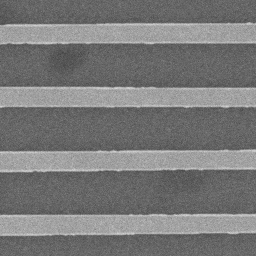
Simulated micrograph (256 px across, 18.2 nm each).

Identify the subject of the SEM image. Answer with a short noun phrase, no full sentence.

lines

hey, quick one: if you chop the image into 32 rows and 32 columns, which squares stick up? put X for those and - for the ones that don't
--------------------------------
--------------------------------
--------------------------------
XXXXXXXXXXXXXXXXXXXXXXXXXXXXXXXX
XXXXXXXXXXXXXXXXXXXXXXXXXXXXXXXX
--------------------------------
--------------------------------
--------------------------------
--------------------------------
--------------------------------
--------------------------------
XXXXXXXXXXXXXXXXXXXXXXXXXXXXXXXX
XXXXXXXXXXXXXXXXXXXXXXXXXXXXXXXX
--------------------------------
--------------------------------
--------------------------------
--------------------------------
--------------------------------
--------------------------------
XXXXXXXXXXXXXXXXXXXXXXXXXXXXXXXX
XXXXXXXXXXXXXXXXXXXXXXXXXXXXXXXX
--------------------------------
--------------------------------
--------------------------------
--------------------------------
--------------------------------
--------------------------------
XXXXXXXXXXXXXXXXXXXXXXXXXXXXXXXX
XXXXXXXXXXXXXXXXXXXXXXXXXXXXXXXX
--------------------------------
--------------------------------
--------------------------------